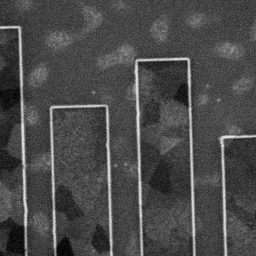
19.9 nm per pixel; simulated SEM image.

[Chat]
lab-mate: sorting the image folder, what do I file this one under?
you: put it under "one or a few lines or trenches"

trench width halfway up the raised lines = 614 nm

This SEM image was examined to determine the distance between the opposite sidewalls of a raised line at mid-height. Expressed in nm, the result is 1040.